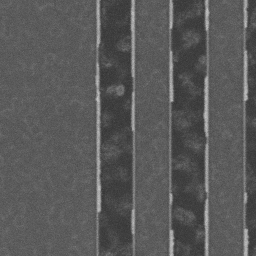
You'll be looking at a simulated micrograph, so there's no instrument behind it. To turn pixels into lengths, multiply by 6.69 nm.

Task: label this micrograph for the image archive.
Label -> one or a few lines or trenches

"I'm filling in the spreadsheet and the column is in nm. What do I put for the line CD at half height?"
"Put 249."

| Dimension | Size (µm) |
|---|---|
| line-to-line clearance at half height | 0.243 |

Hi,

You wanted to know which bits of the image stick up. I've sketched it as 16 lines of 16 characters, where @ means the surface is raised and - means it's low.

------@@---@@--@
------@@---@@--@
------@@---@@--@
------@@---@@--@
------@@---@@--@
------@@---@@--@
------@@---@@--@
------@@---@@--@
------@@---@@--@
------@@---@@--@
------@@---@@--@
------@@---@@--@
------@@---@@--@
------@@---@@--@
------@@---@@--@
------@@---@@--@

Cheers